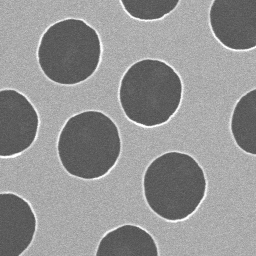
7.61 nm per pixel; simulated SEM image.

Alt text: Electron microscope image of holes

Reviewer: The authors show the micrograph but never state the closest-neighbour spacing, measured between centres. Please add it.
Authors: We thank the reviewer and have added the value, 652 nanometers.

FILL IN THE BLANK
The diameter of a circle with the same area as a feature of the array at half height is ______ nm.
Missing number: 492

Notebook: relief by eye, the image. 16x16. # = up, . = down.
########...##...
###..########...
###...########..
##....##########
###...##...#####
########...#####
..######...####.
..##...#..####..
..##...########.
.###...#########
####...##....###
#########....###
.########....###
..########..####
..#####..#######
..####....######